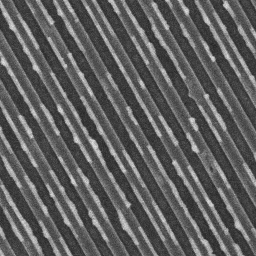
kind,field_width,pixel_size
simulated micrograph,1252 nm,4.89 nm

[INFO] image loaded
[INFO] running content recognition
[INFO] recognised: parallel lines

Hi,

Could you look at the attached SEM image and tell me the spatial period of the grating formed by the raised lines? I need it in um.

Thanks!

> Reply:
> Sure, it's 0.12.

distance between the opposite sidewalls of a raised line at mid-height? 67.9 nm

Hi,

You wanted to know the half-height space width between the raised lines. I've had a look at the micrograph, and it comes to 53.6 nanometres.